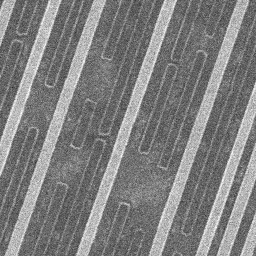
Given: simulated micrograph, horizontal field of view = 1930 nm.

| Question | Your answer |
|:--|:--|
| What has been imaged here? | parallel lines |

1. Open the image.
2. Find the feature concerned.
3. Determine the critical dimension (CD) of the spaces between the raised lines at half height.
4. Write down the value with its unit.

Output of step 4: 87.3 nm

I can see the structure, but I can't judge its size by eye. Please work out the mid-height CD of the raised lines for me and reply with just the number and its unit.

0.0792 µm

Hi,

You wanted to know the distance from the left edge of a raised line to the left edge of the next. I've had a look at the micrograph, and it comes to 167 nm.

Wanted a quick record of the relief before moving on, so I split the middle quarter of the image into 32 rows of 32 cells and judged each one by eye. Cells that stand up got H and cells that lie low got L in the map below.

LLHHHLLLLLLLLLHHHLLLHHLLLLHHLLLL
LHHHLLLLLLLLLLHHHLLHHHLLLLHHLLLL
LHHHLLLLLLLLLHHHLLLHHHLLLHHHLLLH
LHHLLLLLLLLLLHHHLLHHHLLLLHHHLLLH
LHHLLLLLLLLLLHHHLLHHHLLLHHHLLLLH
HHHLLLLLLLLLHHHLLLHHHLLLHHHLLLHH
HHLLLLLLLLLLHHHLLHHHLLLLHHHLLLHH
HHLLLLLLLLLLHHHLLHHHLLLLHHLLLLHH
HHLLLLLLLLLLHHLLLHHHLLLHHHLLLHHH
HLLLLHHLLLLHHHLLLHHLLLLHHHLLLHHH
HLLLLHHHLLLHHLLLHHHLLLLHHLLLLHHL
HLLLLHHHLLLHHLLLHHLLLLHHHLLLHHHL
LLLLHHHLLLHHHLLHHHLLLLHHLLLLHHHL
LLLLHHHLLLHHLLLHHHLLLLHHLLLLHHLL
LLLLHHLLLLHHLLLHHLLLLHHHLLLHHHLL
LLLHHHLLLHHHLLHHHLLLLHHLLLLHHHLL
LLLHHHLLLHHLLLHHHLLLHHHLLLLHHLLL
LLLHHLLLLHHLLLHHLLLLHHHLLLHHHLLL
LLHHHLLLLLLLLHHHLLLLHHLLLLHHHLLH
LLHHHLLLHHLLLHHHLLLHHHLLLLHHLLLH
LLHHLLLHHHLLLHHLLLLHHHLLLHHHLLLH
LLLLLLLHHHLLHHHLLLLHHLLLLHHLLLHH
LLLLLLLHHLLLHHHLLLLLLLLLLHHLLLHH
LLLLLLHHHLLLHHLLLLLLLLLLHHHLLLHH
LLLLLLHHHLLHHHLLLLLLLLLLHHLLLHHH
LLLLLLHHLLLHHHLLLLLLLLLLHHLLLHHH
LLLLLHHHLLLHHLLLLLLLLLLLLLLLLHHL
LLLLLHHHLLHHHLLLLLLLLLLLLLLLHHHL
LLLLLHHLLLHHHLLLLLLLLLLLLLLLHHHL
LLLLHHHLLHHHLLLLLLLLLLLLLLLLHHLL
HLLLHHHLLHHHLLLLLLLLLLLLLLLHHHLL
HLLHHHLLLHHHLLLLLLLLLLLLLLLHHHLL